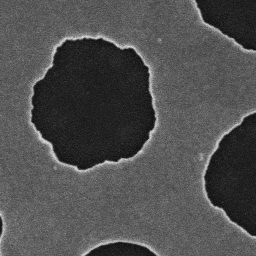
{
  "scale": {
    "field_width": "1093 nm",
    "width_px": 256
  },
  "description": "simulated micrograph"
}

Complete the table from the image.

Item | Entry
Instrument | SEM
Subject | holes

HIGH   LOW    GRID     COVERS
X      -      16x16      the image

XXXXXXXXXXXX----
XXXXXXXXXXXXX---
XXXX---XXXXXXXX-
XXX------XXXXXXX
XXX------XXXXXXX
XX-------XXXXXXX
XX--------XXXXXX
XX--------XXXXX-
XXX------XXXXX--
XXX------XXXX---
XXXXX-XXXXXXX---
XXXXXXXXXXXXX---
XXXXXXXXXXXXX---
XXXXXXXXXXXXXX--
XXXXXXXXXXXXXXX-
XXXXXX---XXXXXXX